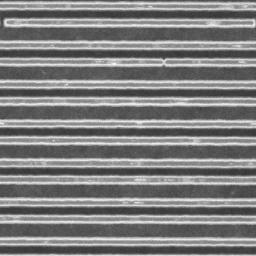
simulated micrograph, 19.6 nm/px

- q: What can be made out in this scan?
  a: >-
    parallel lines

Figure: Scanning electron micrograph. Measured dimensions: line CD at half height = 7.62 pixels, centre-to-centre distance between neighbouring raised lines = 386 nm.